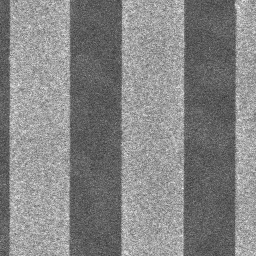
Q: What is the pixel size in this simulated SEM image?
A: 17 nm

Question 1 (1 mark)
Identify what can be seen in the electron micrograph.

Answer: one or a few lines or trenches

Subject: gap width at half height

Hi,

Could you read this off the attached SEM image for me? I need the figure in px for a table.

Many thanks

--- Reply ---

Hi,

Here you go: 52.5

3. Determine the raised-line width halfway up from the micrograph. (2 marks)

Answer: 1030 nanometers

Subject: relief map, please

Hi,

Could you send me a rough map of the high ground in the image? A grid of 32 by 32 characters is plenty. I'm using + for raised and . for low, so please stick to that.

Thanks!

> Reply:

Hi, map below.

.++++++++......++++++++......+++
.++++++++......++++++++.......++
.++++++++......++++++++.......++
.++++++++......++++++++.......++
.++++++++......++++++++.......++
.++++++++......++++++++.......++
.++++++++......++++++++.......++
.++++++++......++++++++.......++
.++++++++......++++++++.......++
.++++++++......++++++++.......++
.++++++++......++++++++.......++
.++++++++......++++++++.......++
.++++++++......++++++++.......++
.++++++++......++++++++.......++
.++++++++......++++++++.......++
.++++++++......++++++++.......++
.++++++++......++++++++....+.+++
.++++++++......++++++++.......++
.++++++++......++++++++.......++
.++++++++......++++++++.......++
.++++++++......++++++++.......++
.++++++++......++++++++.......++
.++++++++......++++++++.......++
.++++++++......++++++++.......++
.++++++++......++++++++.......++
.++++++++......++++++++.......++
.++++++++......++++++++.......++
.++++++++......++++++++......+++
.++++++++......++++++++......+++
.++++++++......++++++++......+++
.++++++++......++++++++......+++
.++++++++......++++++++......+++